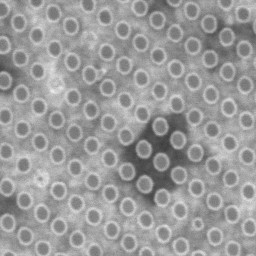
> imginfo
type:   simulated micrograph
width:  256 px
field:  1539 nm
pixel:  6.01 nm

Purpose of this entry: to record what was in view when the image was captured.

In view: a regular array of raised bodies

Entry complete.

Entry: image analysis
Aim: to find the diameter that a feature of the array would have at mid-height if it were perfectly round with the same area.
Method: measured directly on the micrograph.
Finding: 92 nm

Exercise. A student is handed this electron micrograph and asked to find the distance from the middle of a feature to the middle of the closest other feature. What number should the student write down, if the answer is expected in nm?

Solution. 131